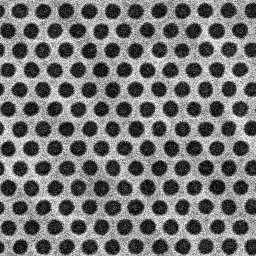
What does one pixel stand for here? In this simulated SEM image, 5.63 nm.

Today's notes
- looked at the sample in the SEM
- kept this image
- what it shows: a regular array of holes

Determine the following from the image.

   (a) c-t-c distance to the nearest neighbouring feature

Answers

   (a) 126 nm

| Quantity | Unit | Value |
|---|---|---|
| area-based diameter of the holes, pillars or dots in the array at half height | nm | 93.1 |